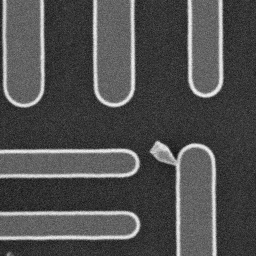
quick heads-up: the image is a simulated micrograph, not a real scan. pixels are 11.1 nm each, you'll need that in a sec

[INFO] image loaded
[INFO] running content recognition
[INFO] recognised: groups of lines, slits or small figures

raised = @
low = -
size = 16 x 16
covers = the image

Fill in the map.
@@@---@@----@@--
@@@---@@----@@--
@@@---@@----@@--
@@@---@@----@@--
@@@---@@----@@--
@@@---@@----@@--
-@--------------
----------------
----------------
@@@@@@@@--@@@---
@@@@@@@@---@@---
-----------@@---
-----------@@---
@@@@@@@@---@@---
@@@@@@@@---@@---
-----------@@---